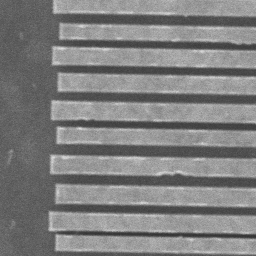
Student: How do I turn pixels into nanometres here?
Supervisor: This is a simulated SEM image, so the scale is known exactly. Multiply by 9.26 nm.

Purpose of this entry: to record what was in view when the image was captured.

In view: parallel lines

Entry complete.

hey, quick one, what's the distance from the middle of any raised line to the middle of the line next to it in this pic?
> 244 nanometers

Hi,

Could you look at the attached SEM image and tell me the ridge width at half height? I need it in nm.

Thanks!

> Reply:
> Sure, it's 166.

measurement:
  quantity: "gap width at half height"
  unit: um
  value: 0.0874